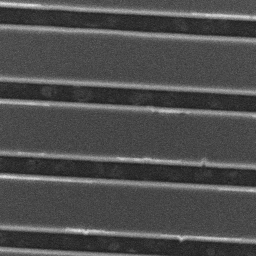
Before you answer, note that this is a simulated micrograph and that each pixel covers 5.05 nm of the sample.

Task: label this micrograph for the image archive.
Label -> one or a few lines or trenches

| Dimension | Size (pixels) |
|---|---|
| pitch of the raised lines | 74.4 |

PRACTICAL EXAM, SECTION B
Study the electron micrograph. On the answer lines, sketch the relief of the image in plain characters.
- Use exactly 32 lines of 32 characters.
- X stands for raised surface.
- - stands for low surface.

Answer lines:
XXXXXXXXXXXXXXXXXXXXXXXXXXXXXXXX
---------------XXXXXXXXXXXXXXXXX
--------------------------------
XXXXXX--------------------------
XXXXXXXXXXXXXXXXXXXXXX----------
XXXXXXXXXXXXXXXXXXXXXXXXXXXXXXXX
XXXXXXXXXXXXXXXXXXXXXXXXXXXXXXXX
XXXXXXXXXXXXXXXXXXXXXXXXXXXXXXXX
XXXXXXXXXXXXXXXXXXXXXXXXXXXXXXXX
XXXXXXXXXXXXXXXXXXXXXXXXXXXXXXXX
-----------XXXXXXXXXXXXXXXXXXXXX
-----------------------------XXX
--------------------------------
XXXXXXXXXXXXXXXXXXX-------------
XXXXXXXXXXXXXXXXXXXXXXXXXXXXXXXX
XXXXXXXXXXXXXXXXXXXXXXXXXXXXXXXX
XXXXXXXXXXXXXXXXXXXXXXXXXXXXXXXX
XXXXXXXXXXXXXXXXXXXXXXXXXXXXXXXX
XXXXXXXXXXXXXXXXXXXXXXXXXXXXXXXX
-----XXXXXXXXXXXXXXXXXXXXXXXXXXX
-----------------------XXXXXXXXX
--------------------------------
XXXXXXXXXXXX--------------------
XXXXXXXXXXXXXXXXXXXXXXXXXXXXXX--
XXXXXXXXXXXXXXXXXXXXXXXXXXXXXXXX
XXXXXXXXXXXXXXXXXXXXXXXXXXXXXXXX
XXXXXXXXXXXXXXXXXXXXXXXXXXXXXXXX
XXXXXXXXXXXXXXXXXXXXXXXXXXXXXXXX
-XXXXXXXXXXXXXXXXXXXXXXXXXXXXXXX
-------------------XXXXXXXXXXXXX
--------------------------------
XXXXXXX-------------------------